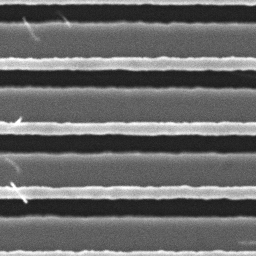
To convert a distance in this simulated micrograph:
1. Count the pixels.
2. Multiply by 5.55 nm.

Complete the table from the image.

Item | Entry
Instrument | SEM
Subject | lines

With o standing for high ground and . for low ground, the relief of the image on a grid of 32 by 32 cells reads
oo.oooooo......ooo.ooooooooooooo
................................
................................
oooooooooooooooooooooooooooooooo
oooooooooooooooooooooooooooooooo
oooooooooooooooooooooooooooooooo
oooooooooooooooooooooooooooooooo
oooooooooooooooooooooooooooooooo
oooooooooooooooooooooooooooooooo
................................
................................
oooooooooooooooooooooooooooooooo
oooooooooooooooooooooooooooooooo
oooooooooooooooooooooooooooooooo
oooooooooooooooooooooooooooooooo
oooooooooooooooooooooooooooooooo
oooooooooooooooooooooooooooooooo
................................
................................
oooooooooooooooooooooooooooooooo
oooooooooooooooooooooooooooooooo
oooooooooooooooooooooooooooooooo
oooooooooooooooooooooooooooooooo
oooooooooooooooooooooooooooooooo
oooooooooooooooooooooooooooooooo
................................
................................
oooooooooooooooooooooooooooooooo
oooooooooooooooooooooooooooooooo
oooooooooooooooooooooooooooooooo
oooooooooooooooooooooooooooooooo
oooooooooooooooooooooooooooooooo